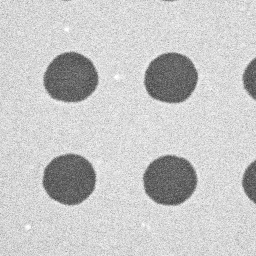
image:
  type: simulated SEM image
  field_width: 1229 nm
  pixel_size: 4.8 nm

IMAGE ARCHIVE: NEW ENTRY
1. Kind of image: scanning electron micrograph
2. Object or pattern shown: holes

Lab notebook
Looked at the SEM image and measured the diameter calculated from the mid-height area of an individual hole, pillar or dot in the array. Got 0.252 µm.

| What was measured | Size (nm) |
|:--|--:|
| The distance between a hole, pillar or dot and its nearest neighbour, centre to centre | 482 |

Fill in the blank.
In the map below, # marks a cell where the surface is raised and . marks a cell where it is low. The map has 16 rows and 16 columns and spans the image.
################
################
################
####.#####..####
###...###...###.
###...###...###.
################
################
################
################
###...###...###.
###...###...###.
###..#####..####
################
################
################